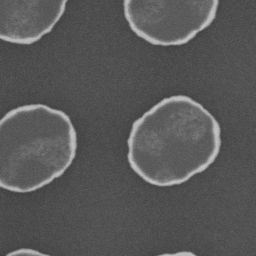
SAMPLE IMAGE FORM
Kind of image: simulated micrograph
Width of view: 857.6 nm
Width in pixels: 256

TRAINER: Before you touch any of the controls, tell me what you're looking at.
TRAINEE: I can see raised bodies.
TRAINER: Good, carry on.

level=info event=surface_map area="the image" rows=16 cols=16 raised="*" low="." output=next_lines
****....*****...
***.....*****...
**.......***....
................
................
................
..........**....
****.....****...
*****...******..
*****...******..
****....*****...
***.......*.....
................
................
................
................